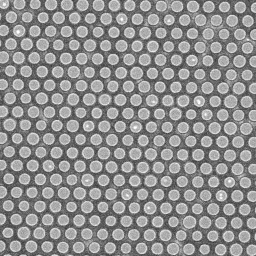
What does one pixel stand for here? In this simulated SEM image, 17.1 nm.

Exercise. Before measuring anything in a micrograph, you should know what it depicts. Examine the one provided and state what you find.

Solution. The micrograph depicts a regular array of raised bodies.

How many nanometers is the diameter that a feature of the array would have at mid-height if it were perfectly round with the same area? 184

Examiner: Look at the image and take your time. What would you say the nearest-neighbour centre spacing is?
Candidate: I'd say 0.265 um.